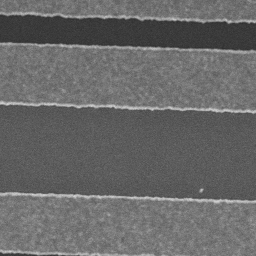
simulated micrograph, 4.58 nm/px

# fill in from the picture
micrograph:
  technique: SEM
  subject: lines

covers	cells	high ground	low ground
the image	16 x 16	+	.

++++++++++++++++
................
................
++++++++++++++++
++++++++++++++++
++++++++++++++++
++++++++++++++++
................
................
................
................
................
+++++++++++++...
++++++++++++++++
++++++++++++++++
++++++++++++++++